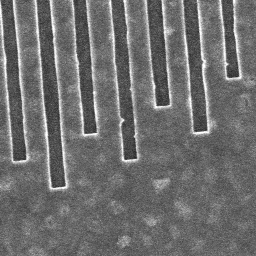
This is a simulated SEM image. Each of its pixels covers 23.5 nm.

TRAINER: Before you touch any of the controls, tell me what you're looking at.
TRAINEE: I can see parallel lines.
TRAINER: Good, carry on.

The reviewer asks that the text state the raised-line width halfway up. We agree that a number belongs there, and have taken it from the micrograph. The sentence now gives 514 nm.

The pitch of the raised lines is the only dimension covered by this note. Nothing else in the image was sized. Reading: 862 nm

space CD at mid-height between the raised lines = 0.333 um